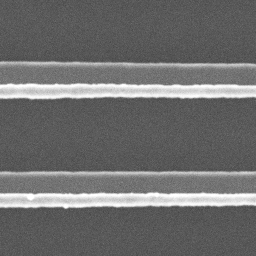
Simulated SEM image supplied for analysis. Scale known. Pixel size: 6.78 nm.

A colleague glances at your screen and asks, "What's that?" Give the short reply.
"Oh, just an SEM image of lines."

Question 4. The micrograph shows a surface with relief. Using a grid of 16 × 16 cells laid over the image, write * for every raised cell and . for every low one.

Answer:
................
................
................
................
****************
****************
................
................
................
................
................
****************
****************
................
................
................